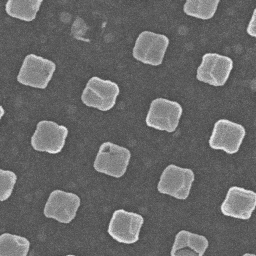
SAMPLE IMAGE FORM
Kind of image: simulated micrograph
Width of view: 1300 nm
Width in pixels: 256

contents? a regular array of raised bodies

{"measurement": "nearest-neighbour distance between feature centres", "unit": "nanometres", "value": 340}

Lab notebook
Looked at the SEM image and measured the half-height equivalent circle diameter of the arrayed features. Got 168 nanometres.